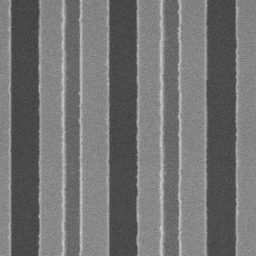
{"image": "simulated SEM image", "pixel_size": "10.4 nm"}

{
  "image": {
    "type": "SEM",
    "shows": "lines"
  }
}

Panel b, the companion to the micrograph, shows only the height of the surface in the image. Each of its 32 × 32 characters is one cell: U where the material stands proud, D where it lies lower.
UDDDDUUUUUUUUUDDDUUUUUUUUUDDDDUU
UDDDDUUUUUUUUUDDDUUUUUUUUUDDDDUU
UDDDDUUUUUUUUUDDDUUUUUUUUUDDDDUU
UDDDDUUUUUUUUUDDDUUUUUUUUUDDDDUU
UDDDDUUUUUUUUUDDDUUUUUUUUUDDDDUU
UDDDDUUUUUUUUUDDDUUUUUUUUUDDDDUU
UDDDDUUUUUUUUUDDDUUUUUUUUUDDDDUU
UDDDDUUUUUUUUUDDDUUUUUUUUUDDDDUU
UDDDDUUUUUUUUUDDDUUUUUUUUUDDDDUU
UDDDDUUUUUUUUUDDDUUUUUUUUUDDDDUU
UDDDDUUUUUUUUUDDDUUUUUUUUUDDDDUU
UDDDDUUUUUUUUUDDDUUUUUUUUUDDDDUU
UDDDDUUUUUUUUUDDDUUUUUUUUUDDDDUU
UDDDDUUUUUUUUUDDDUUUUUUUUUDDDDUU
UDDDDUUUUUUUUUDDDUUUUUUUUUDDDDUU
UDDDDUUUUUUUUUDDDUUUUUUUUUDDDDUU
UDDDDUUUUUUUUUDDDUUUUUUUUUDDDDUU
UDDDDUUUUUUUUUDDDUUUUUUUUUDDDDUU
UDDDDUUUUUUUUUDDDUUUUUUUUUDDDDUU
UDDDDUUUUUUUUUDDDUUUUUUUUUDDDDUU
UDDDDUUUUUUUUUDDDUUUUUUUUUDDDDUU
UDDDDUUUUUUUUUDDDUUUUUUUUUDDDDUU
UDDDDUUUUUUUUUDDDUUUUUUUUUDDDDUU
UDDDDUUUUUUUUUDDDUUUUUUUUUDDDDUU
UDDDDUUUUUUUUUDDDUUUUUUUUUDDDDUU
UDDDDUUUUUUUUUDDDUUUUUUUUUDDDDUU
UDDDDUUUUUUUUUDDDUUUUUUUUUDDDDUU
UDDDDUUUUUUUUUDDDUUUUUUUUUDDDDUU
UDDDDUUUUUUUUUDDDUUUUUUUUUDDDDUU
UDDDDUUUUUUUUUDDDUUUUUUUUUDDDDUU
UDDDDUUUUUUUUUDDDUUUUUUUUUDDDDUU
UDDDDUUUUUUUUUDDDUUUUUUUUUDDDDUU